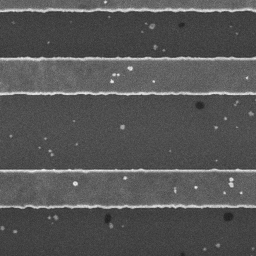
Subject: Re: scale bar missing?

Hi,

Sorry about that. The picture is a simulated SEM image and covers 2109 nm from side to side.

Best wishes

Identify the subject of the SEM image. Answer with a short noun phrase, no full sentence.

lines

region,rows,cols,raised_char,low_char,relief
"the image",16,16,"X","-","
XXXXXXXXXXXXXXXX
----------------
----------------
----------------
XXXXXXXXXXXXXXXX
XXXXXXXXXXXXXXXX
----------------
----------------
----------------
----------------
----------------
XXXXXXXXXXXXXXXX
XXXXXXXXXXXXXXXX
----------------
----------------
----------------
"